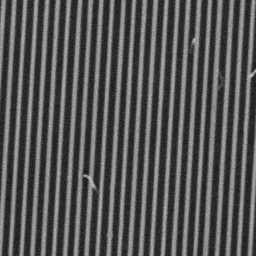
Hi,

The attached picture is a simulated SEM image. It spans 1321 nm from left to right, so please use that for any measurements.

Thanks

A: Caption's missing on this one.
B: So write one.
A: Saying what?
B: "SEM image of parallel lines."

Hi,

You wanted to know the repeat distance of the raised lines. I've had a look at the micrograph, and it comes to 56 nm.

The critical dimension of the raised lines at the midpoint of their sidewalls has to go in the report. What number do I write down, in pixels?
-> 3.86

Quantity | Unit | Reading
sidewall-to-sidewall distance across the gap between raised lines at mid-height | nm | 34.7